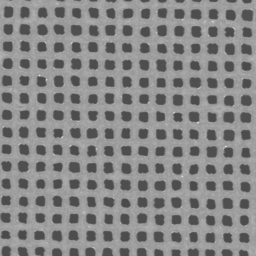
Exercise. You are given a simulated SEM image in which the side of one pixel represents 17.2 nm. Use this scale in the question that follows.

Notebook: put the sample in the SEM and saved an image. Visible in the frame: a regular array of holes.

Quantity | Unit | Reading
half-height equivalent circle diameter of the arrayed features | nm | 182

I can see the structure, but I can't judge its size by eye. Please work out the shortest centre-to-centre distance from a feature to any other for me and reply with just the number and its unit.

285 nanometres